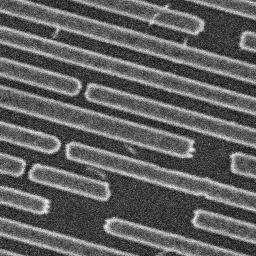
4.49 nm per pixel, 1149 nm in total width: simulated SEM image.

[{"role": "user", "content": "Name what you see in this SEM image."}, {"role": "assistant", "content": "parallel lines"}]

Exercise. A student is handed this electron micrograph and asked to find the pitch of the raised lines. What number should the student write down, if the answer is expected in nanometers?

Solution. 138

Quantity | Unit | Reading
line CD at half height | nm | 74.6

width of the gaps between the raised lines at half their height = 62.6 nanometres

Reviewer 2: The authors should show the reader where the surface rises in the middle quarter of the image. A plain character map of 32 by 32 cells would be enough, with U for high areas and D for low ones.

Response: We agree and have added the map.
DDDDDUUUUUUUUUUUUUUDDDDDDDDDDDDD
DDDDDDDDUUUUUUUUUUUUUUUDDDDDDDDD
DDDDDDDDDDDDUUUUUUUUUUUUUUUDDDDD
UUDDDDDDDDDDDDDUUUUUUUUUUUUUUUDD
UUUUDDDDDDDDDDDDDDDUUUUUUUUUUUUU
UUUUDDUUUDDDDDDDDDDDDDUUUUUUUUUU
UUUUDDUUUUUUDDDDDDDDDDDDDUUUUUUU
DUUDDUUUUUUUUUUUDDDDDDDDDDDDDDUU
DDDDDDUUUUUUUUUUUUUDDDDDDDDDDDDD
DDDDDDDDUUUUUUUUUUUUUUUDDDDDDDDD
UUDDDDDDDDDUUUUUUUUUUUUUUUDDDDDD
UUUUUUDDDDDDDDDUUUUUUUUUUUUUUUDD
UUUUUUUUUDDDDDDDDDUUUUUUUUUUUUUU
UUUUUUUUUUUUUDDDDDDDDDUUUUUUUUUU
UUUUUUUUUUUUUUUUDDDDDDDDDUUUUUUU
DDUUUUUUUUUUUUUUUUUUDDDDDDDDDUUU
DDDDDUUUUUUUUUUUUUUUUUUDDDDDDDDD
DDDDDDDDDUUUUUUUUUUUUUUUUUUDDDDD
DDDDDDDDDDDDUUUUUUUUUUUUUUUUUUUD
DDDDDDDDDDDDDDDDUUUUUUUUUUUUUUUU
DUUUUUDDDDDDDDDDDDDUUUUUUUUUUUUU
DUUUUUUUUDDDDDDDDDDDDDDUUUUUUUUU
DUUUUUUUUUUUUDDDDDDDDDDDDDUUUUUD
DUUUUUUUUUUUUUUUDDDDDDDDDDDDDDDD
DDDDDUUUUUUUUUUUUUUUDDDDDDDDDDDD
DDDDDDDDUUUUUUUUUUUUUUUDDDDDDDDD
DDDDDDDDDDDDUUUUUUUUUUUUUUDDDDDD
UUDDDDDDDDDDDDDUUUUUUUUUUUUUUUDD
UUUUUUDDDDDDDDDDDDDUUUUUUUUUUUUU
UUUUUUUUUDDDDDDDDDDDDDUUUUUUUUUU
UUUUUUUUUUUDDDDDDDDDDDDDDDUUUUUU
UUUUUUUUUUUDDDDDDDDDDDDDDDDDDUUU